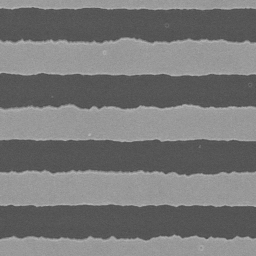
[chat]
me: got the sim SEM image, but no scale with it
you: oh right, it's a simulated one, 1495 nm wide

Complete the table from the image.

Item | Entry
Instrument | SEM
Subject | lines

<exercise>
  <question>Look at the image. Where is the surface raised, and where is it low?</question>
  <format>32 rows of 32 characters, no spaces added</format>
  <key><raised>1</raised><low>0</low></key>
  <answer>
11111111111111111111111111111111
00000000000000000000000000000000
00000000000000000000000000000000
00000000000000000000000000000000
00000000000000000000000000000000
11111111111111111111111111111111
11111111111111111111111111111111
11111111111111111111111111111111
11111111111111111111111111111111
00000000000000000000000000000000
00000000000000000000000000000000
00000000000000000000000000000000
00000000000000000000000000000000
00011111110111100111011111111111
11111111111111111111111111111111
11111111111111111111111111111111
11111111111111111111111111111111
00001100010000111100111100011011
00000000000000000000000000000000
00000000000000000000000000000000
00000000000000000000000000000000
00011100011110000101000000000000
11111111111111111111111111111111
11111111111111111111111111111111
11111111111111111111111111111111
11111111111111111111111111111111
00000000000000000000000000000000
00000000000000000000000000000000
00000000000000000000000000000000
00000000000000000000000000000000
11111111111111111111111111111111
11111111111111111111111111111111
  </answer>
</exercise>